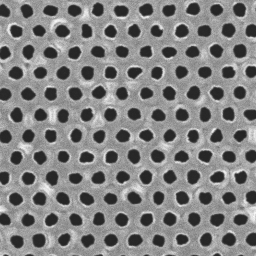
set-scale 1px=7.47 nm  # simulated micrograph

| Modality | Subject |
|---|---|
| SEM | a regular array of holes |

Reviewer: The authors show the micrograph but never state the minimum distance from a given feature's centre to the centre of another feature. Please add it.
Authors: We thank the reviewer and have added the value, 0.173 microns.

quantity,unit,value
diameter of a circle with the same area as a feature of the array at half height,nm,95.8